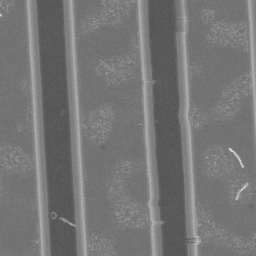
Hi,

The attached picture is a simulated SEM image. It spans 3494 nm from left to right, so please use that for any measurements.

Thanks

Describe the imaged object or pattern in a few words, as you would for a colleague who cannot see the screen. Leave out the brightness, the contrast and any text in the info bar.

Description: one or a few lines or trenches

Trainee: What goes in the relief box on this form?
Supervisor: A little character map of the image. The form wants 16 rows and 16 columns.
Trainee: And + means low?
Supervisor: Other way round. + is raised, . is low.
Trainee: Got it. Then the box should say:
++..+++++..+++++
++..+++++..+++++
++..+++++..+++++
++..+++++..+++++
++..+++++..+++++
++...++++..+++++
++...++++..+++++
++...++++...++++
++...++++...++++
+++..++++...++++
+++..++++...++++
+++..+++++..++++
+++..+++++..++++
+++..+++++..++++
+++..+++++..++++
+++..+++++..++++